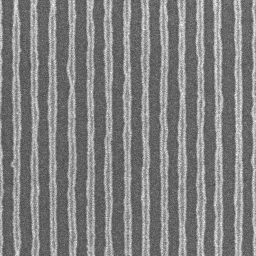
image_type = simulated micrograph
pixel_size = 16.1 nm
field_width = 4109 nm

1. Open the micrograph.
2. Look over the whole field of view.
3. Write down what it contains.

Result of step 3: parallel lines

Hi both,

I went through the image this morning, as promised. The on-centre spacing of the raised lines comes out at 18.5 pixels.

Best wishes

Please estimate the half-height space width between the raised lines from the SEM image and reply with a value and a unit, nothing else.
13.6 px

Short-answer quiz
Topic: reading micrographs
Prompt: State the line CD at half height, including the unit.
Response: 86.3 nanometres